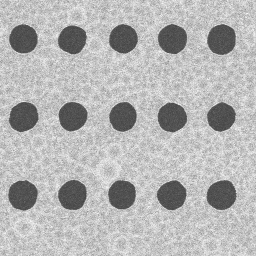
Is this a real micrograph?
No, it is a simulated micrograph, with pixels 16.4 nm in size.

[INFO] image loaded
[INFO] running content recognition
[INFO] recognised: a regular array of holes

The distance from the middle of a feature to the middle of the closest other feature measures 806 nm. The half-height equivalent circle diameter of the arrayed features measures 477 nanometres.